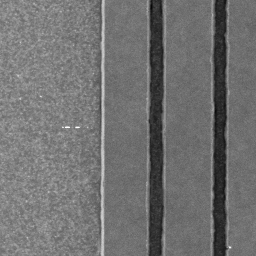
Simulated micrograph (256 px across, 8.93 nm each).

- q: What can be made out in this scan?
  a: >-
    one or a few lines or trenches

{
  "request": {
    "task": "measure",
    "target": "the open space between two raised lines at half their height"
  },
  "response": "127 nm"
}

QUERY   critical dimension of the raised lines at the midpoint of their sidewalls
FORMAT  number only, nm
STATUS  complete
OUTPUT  420